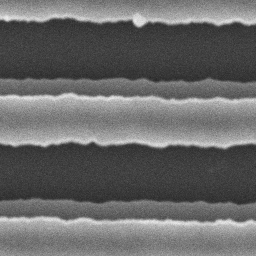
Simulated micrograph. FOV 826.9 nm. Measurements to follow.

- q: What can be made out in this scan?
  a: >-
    lines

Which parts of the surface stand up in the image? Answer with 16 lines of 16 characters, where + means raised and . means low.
++++++++++++++++
.............+..
................
................
................
................
++++++++++++++++
++++++++++++++++
++++++++++++++++
................
................
................
................
................
++++++++++++++++
++++++++++++++++